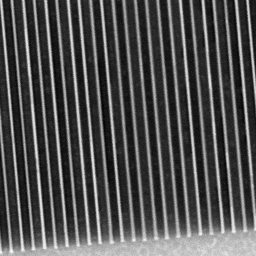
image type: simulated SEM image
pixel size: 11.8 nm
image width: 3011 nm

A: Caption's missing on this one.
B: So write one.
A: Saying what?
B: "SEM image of parallel lines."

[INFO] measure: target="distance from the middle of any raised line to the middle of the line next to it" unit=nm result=131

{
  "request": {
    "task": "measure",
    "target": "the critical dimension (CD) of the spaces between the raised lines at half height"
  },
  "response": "102 nanometres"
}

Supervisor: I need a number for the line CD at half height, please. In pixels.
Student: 1.99